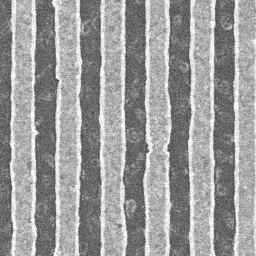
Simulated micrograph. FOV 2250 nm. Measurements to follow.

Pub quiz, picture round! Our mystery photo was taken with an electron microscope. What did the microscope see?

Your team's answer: parallel lines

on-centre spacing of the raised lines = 393 nanometers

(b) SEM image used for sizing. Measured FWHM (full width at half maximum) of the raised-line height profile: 178 nm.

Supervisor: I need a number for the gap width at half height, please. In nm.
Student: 211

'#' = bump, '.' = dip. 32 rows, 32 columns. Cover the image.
..##...###...##....##...###...##
..##...###...##....##...###...##
..##...###...##....##...###...##
..##...###...##...###...###...##
..##...###...##...###...###...##
..##...###...##....##...###...##
..##...###...##....##...##....##
..##...###...##....##...##...###
..##...###...##...###...##....##
..##...###...##...###...##....##
..##...###...##....##...##....##
..##...###...##....##...##....##
..##...###...##...###...##....##
..##...###...##...###...##....##
..##...###...##...###...###...##
.###...###...##....##...###...##
.###...###...##....##...##....##
..##...###...###...##...##....##
..##...###...###...##...##....##
..##...###...##....##...###...##
.###...###...##....##...###...##
.###...###...##...###...###...##
..##...###...##...###...###...##
..##...###...##...###...###...##
..##...###...##...###...###...##
..##...###...##...###...###...##
..##...###...##...###...##....##
..##...###...##...###...##....##
..##...###...##...###...##....##
..##...###...###..###...###...##
..##...###...##...###...##....##
..##...###...##...###...###..###